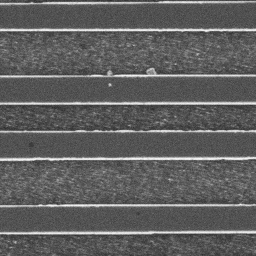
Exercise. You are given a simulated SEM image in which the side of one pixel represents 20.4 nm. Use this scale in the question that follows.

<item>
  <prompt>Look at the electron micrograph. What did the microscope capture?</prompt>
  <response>lines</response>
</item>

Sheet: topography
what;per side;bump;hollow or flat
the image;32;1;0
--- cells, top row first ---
11111111111111111111111111111111
11111111111111111111111111111111
11111111111111111111111111111111
11111111111111111111111111111111
00000000000000000000000000000000
00000000000000000000000000000000
00000000000000000000000000000000
00000000000000000000000000000000
00000000000000000000000000000000
00000000000010111111111111111111
11111111111111111111111111111111
11111111111111111111111111111111
11111111111111111111111111111111
00000000000000000000000000000000
00000000000000000000000000000000
00000000000000000000000000000000
11111111111111111111111111111111
11111111111111111111111111111111
11111111111111111111111111111111
11111111111111111111111111111111
00000000000000000000000000000000
00000000000000000000000000000000
00000000000000000000000000000000
00000000000000000000000000000000
00000000000000000000000000000000
00000000000000000000000000000000
11111111111111111111111111111111
11111111111111111111111111111111
11111111111111111111111111111111
00000000000000000000000000000000
00000000000000000000000000000000
00000000000000000000000000000000